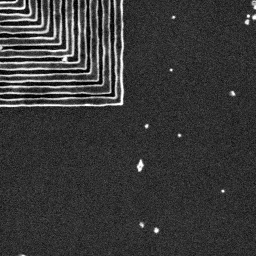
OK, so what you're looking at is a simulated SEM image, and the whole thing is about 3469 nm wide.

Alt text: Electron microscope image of groups of lines, slits or small figures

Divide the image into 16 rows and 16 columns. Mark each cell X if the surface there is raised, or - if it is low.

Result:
XXX-XXX---------
XXX--XXX--------
XXX--XXX--------
X-XX-XX---------
XXXXXXX---------
XXX-XXX---------
----------------
----------------
----------------
----------------
----------------
----------------
----------------
----------------
----------------
----------------